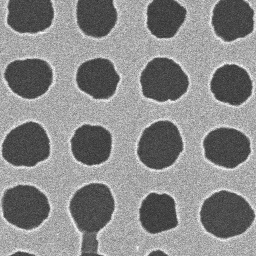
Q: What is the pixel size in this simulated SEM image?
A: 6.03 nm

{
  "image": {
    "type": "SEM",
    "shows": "a regular array of holes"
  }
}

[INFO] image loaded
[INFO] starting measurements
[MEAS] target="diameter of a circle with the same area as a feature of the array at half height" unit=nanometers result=267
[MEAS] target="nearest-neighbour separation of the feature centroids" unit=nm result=392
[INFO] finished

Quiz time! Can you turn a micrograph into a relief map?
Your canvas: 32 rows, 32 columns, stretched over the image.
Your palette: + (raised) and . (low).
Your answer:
+.....++++....+++++...+++++....+
+......+++.....+++.....++++.....
+......+++.....+++.....+++......
++....++++....++++....+++++.....
+++++++++++..++++++...+++++....+
++++++++++++++++++++++++++++++++
++++++++++++++++++++++++++++++++
++...++++++...+++++..+++++++++++
+.....++++....++++.....++++...++
.......+++.....+++.....++++....+
+.....++++.....+++......++......
++....+++++...++++.....+++.....+
+++++++++++++++++++...+++++....+
++++++++++++++++++++++++++++++++
++++++++++++++++++++++++++++++++
+++..++++++++++++++...++++++++++
+.....+++.....++++....++++....++
......+++.....+++......+++.....+
......+++.....+++......+++.....+
......+++.....+++.....++++.....+
+....+++++..++++++...++++++...++
++++++++++++++++++++++++++++++++
++++++++++++++++++++++++++++++++
+....+++++....++++++++++++++++++
......+++.....++++...+++++....++
......+++.....++++....+++......+
......+++.....+++.....+++.......
+.....+++.....++++....+++.......
++..++++++...+++++....++++.....+
++++++++++..+++++++++++++++..+++
++++++++++..++++++++++++++++++++
++.+++++++..+++++++.++++++++++++